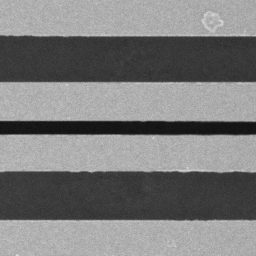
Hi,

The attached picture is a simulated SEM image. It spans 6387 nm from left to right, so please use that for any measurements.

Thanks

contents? lines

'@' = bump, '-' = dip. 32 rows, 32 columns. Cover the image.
@@@@@@@@@@@@@@@@@@@@@@@@@@@@@@@@
@@@@@@@@@@@@@@@@@@@@@@@@@@@@@@@@
@@@@@@@@@@@@@@@@@@@@@@@@@@@@@@@@
@@@@@@@@@@@@@@@@@@@@@@@@@@@@@@@@
--------------------------------
--------------------------------
--------------------------------
--------------------------------
--------------------------------
--------------------------------
@@@@@@@@@@@@@@@@@@@@@@@@@@@@@@@@
@@@@@@@@@@@@@@@@@@@@@@@@@@@@@@@@
@@@@@@@@@@@@@@@@@@@@@@@@@@@@@@@@
@@@@@@@@@@@@@@@@@@@@@@@@@@@@@@@@
@@@@@@@@@@@@@@@@@@@@@@@@@@@@@@@@
--------------------------------
--------------------------------
@@@@@@@@@@@@@@@@@@@@@@@@@@@@@@@@
@@@@@@@@@@@@@@@@@@@@@@@@@@@@@@@@
@@@@@@@@@@@@@@@@@@@@@@@@@@@@@@@@
@@@@@@@@@@@@@@@@@@@@@@@@@@@@@@@@
--------------------------------
--------------------------------
--------------------------------
--------------------------------
--------------------------------
--------------------------------
--------------------------------
@@@@@@@@@@@@@@@@@@@@@@@@@@@@@@@@
@@@@@@@@@@@@@@@@@@@@@@@@@@@@@@@@
@@@@@@@@@@@@@@@@@@@@@@@@@@@@@@@@
@@@@@@@@@@@@@@@@@@@@@@@@@@@@@@@@